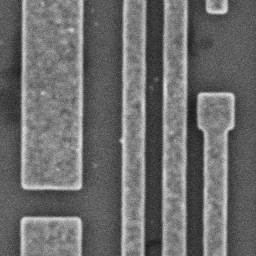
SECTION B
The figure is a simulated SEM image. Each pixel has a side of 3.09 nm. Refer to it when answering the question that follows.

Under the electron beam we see wiring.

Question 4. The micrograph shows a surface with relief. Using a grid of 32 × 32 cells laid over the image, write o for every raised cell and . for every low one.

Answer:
...ooooooo......oo...oo...oo....
...ooooooo......oo...oo...oo....
...ooooooo......oo...oo.........
...ooooooo......oo...oo.........
...ooooooo.....ooo...oo.........
...ooooooo......oo...oo.........
...ooooooo......oo...oo.........
...ooooooo......oo...oo.........
...ooooooo.....ooo...oo.........
...ooooooo.....ooo...oo.........
...ooooooo.....ooo...oo.........
...ooooooo.....ooo...oo.........
...ooooooo.....ooo...oo..oooo...
...ooooooo.....ooo..ooo..oooo...
...ooooooo.....ooo..ooo..oooo...
...ooooooo.....ooo..ooo..oooo...
...ooooooo.....ooo..ooo..oooo...
...ooooooo.....ooo..ooo...oo....
...ooooooo.....ooo..ooo...oo....
...ooooooo.....ooo..ooo...oo....
...ooooooo.....ooo..ooo...oo....
...ooooooo.....ooo..ooo...oo....
...ooooooo.....ooo..ooo...oo....
...ooooooo.....ooo..ooo...oo....
...............ooo..ooo...oo....
...............ooo..ooo...oo....
...............ooo..ooo..ooo....
...ooooooo.....ooo..ooo..ooo....
...ooooooo.....ooo..ooo...oo....
...ooooooo.....ooo..ooo..ooo....
...ooooooo.....ooo..ooo..ooo....
...ooooooo.....ooo..ooo...oo....